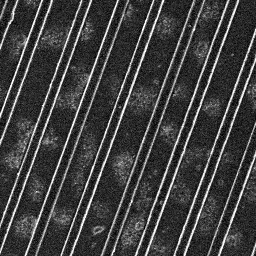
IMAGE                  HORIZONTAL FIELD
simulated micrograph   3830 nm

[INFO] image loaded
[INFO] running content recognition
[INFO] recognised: parallel lines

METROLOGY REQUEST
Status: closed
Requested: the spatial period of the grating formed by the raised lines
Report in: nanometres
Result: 521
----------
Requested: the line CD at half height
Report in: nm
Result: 151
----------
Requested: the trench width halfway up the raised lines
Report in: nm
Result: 375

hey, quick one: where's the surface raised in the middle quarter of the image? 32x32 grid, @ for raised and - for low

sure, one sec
@-------@@------@@@--------@@---
@------@@@------@@--------@@@---
-------@@-------@@--------@@----
------@@@------@@@-------@@@----
------@@@------@@@-------@@@----
------@@-------@@--------@@-----
-----@@@------@@@-------@@@-----
-----@@@------@@@-------@@@-----
-----@@-------@@--------@@------
----@@@------@@@-------@@@------
----@@@------@@--------@@@------
----@@------@@@--------@@------@
---@@@------@@@-------@@@------@
---@@@------@@--------@@------@@
--@@@------@@@-------@@@------@@
--@@@------@@@-------@@@------@@
--@@-------@@--------@@------@@@
-@@@------@@@-------@@@------@@@
-@@@------@@@-------@@@------@@-
-@@-------@@--------@@------@@@-
@@@------@@@-------@@@------@@--
@@@------@@--------@@@-----@@@--
@@------@@@--------@@------@@@--
@@------@@@--@-@--@@@------@@---
@@------@@---@@@@-@@@-----@@@---
@------@@@----@@-@@@------@@@---
@------@@--------@@@------@@----
-------@@--------@@------@@@----
------@@@-------@@@------@@@----
------@@@-------@@@------@@-----
------@@--------@@------@@@-----
-----@@@-------@@@------@@------